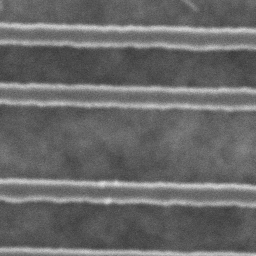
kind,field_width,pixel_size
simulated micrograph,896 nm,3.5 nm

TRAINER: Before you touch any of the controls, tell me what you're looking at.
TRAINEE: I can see lines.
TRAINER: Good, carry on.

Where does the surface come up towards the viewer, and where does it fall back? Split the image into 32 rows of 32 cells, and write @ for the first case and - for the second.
--------------------------------
--------------------------------
--------------------------------
@@@@@@@@@@@@@@@@@@-@@-----------
@@@@@@@@@@@@@@@@@@@@@@@@@@@@@@@@
---@@@@@@@@@@@@@@@@@@@@@@@@@@@@@
--------------------------------
--------------------------------
--------------------------------
--------------------------------
--------------------------------
@@@@@@@@@@@@@@@@@@@@@@@@@@@@@@@@
@@@@@@@@@@@@@@@@@@@@@@@@@@@@@@@@
--------------------@---@@@@@@@@
--------------------------------
--------------------------------
--------------------------------
--------------------------------
--------------------------------
--------------------------------
--------------------------------
--------------------------------
@@@-----------------------------
@@@@@@@@@@@@@@@@@@@@@@@@@@@@@@@@
@@@@@@@@@@@@@@@@@@@@@@@@@@@@@@@@
--------------------@---@@@@@@@@
--------------------------------
--------------------------------
--------------------------------
--------------------------------
--------------------------------
@@@@@@@@@@@@@@@@@@--------------